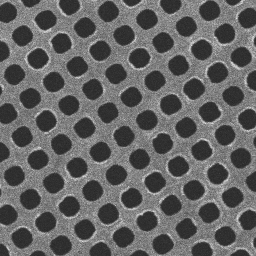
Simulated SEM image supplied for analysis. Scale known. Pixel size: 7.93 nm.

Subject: a regular array of holes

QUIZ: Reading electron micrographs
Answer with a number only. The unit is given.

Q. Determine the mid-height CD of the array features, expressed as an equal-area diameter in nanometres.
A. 161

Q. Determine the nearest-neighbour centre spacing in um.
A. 0.22